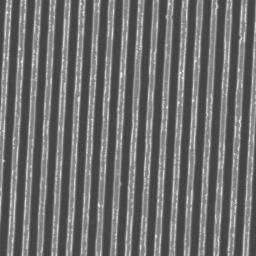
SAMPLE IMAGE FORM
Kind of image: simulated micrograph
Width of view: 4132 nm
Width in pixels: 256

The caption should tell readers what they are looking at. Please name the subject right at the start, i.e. parallel lines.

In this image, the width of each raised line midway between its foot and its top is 7.61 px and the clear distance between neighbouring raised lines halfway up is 123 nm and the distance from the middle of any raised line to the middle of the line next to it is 14.7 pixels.